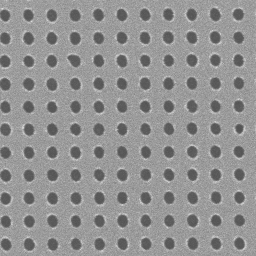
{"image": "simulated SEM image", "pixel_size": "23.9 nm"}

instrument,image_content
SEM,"a regular array of holes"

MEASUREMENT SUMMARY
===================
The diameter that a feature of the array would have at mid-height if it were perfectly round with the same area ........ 0.277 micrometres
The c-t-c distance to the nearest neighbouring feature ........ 0.544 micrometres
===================